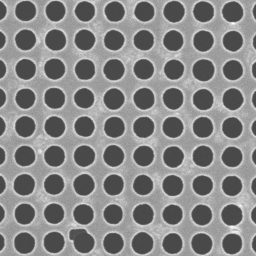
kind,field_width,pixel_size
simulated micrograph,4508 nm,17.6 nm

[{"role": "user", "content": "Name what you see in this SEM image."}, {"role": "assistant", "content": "a regular array of holes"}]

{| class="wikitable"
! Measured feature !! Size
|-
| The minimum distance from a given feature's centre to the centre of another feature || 507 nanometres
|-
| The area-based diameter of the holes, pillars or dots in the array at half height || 372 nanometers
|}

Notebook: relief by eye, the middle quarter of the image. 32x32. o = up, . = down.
ooo.....oo.....ooo....ooo.....oo
ooo.....oo.....oo......oo.....oo
ooo.....oo.....ooo....ooo.....oo
oooo...oooo...oooo....oooo...ooo
oooooooooooooooooooooooooooooooo
oooooooooooooooooooooooooooooooo
oooo..ooooo...oooo....oooo...ooo
ooo....ooo.....oo.....ooo.....oo
oo......oo.....oo......oo.....oo
ooo....ooo.....oo......oo.....oo
ooo....ooo.....ooo....oooo...ooo
oooooooooooo.oooooooooooooo.oooo
oooooooooooooooooooooooooooooooo
oooo...ooooo..ooooo..ooooo...ooo
ooo....ooo.....ooo....ooo.....oo
ooo.....oo.....oo......oo.....oo
ooo.....oo.....oo......oo.....oo
ooo....oooo....ooo....ooo....ooo
oooooooooooo.ooooooooooooooooooo
oooooooooooooooooooooooooooooooo
oooo..ooooo..oooooo..oooooo.oooo
ooo....ooo....oooo....ooo....ooo
oo......oo.....oo......oo.....oo
oo......oo.....oo......oo.....oo
ooo....ooo.....ooo....ooo.....oo
oooo..oooooo.oooooo..ooooo...ooo
oooooooooooooooooooooooooooooooo
ooooo.oooooo.ooooooooooooooooooo
ooo....oooo....ooo....ooo....ooo
oo......oo.....oo.....ooo.....oo
oo......oo.....oo.....oo......oo
ooo....ooo.....oo.....ooo.....oo